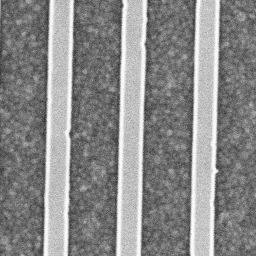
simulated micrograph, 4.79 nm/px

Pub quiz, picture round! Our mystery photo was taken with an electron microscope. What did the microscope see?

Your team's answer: one or a few lines or trenches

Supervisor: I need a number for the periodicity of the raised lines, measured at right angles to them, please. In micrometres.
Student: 0.35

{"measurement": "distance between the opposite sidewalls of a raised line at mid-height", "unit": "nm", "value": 101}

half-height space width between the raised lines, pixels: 51.9